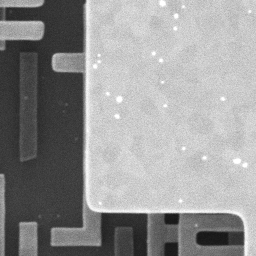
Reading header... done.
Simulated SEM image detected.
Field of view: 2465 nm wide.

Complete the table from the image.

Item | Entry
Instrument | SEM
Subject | wiring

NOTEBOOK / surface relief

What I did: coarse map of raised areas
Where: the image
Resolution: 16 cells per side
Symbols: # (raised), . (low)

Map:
.....###########
.....###########
.....###########
.....###########
.....###########
.....###########
.....###########
.....###########
.....###########
.....###########
.....###########
.....###########
.....###########
...............#
...............#
...............#